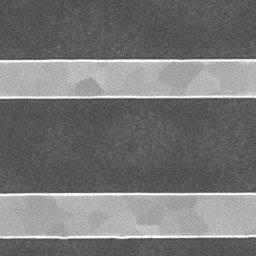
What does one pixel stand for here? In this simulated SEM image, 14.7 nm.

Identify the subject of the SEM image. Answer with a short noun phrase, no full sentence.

one or a few lines or trenches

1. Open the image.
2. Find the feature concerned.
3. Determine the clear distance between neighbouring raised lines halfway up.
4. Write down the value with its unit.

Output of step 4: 1420 nm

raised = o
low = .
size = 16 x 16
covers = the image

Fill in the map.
................
................
................
................
oooooooooooooooo
oooooooooooooooo
................
................
................
................
................
................
oooooooooooooooo
oooooooooooooooo
oooooooooooooooo
................